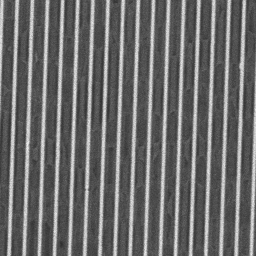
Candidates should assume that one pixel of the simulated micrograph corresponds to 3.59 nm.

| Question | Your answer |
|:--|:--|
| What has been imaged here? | parallel lines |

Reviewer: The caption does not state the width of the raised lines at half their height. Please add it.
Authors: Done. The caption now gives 13 nm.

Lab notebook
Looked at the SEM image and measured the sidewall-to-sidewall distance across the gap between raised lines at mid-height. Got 39.4 nanometers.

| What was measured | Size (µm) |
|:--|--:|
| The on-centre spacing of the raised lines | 0.0543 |